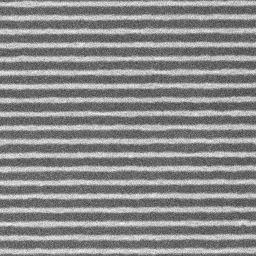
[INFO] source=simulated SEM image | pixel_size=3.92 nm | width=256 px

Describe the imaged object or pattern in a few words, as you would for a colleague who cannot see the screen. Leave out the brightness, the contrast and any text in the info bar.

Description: parallel lines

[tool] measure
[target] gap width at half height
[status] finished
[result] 0.0377 microns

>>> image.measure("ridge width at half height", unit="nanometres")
17.1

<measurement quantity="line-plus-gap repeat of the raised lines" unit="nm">53.9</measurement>